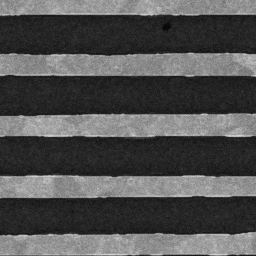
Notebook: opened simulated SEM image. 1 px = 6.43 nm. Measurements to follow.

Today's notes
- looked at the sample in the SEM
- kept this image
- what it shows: lines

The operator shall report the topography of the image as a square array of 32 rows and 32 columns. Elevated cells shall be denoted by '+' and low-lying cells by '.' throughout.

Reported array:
++++++++++++++++++++++++++++++++
++++++++++++++++++++++++++++++++
................................
................................
................................
................................
................................
++++++++++++++++++++++++++++++++
++++++++++++++++++++++++++++++++
................................
................................
................................
................................
................................
..+.++++++++++++++++++++++++++++
++++++++++++++++++++++++++++++++
++++++++++++++++++++++++++++++++
................................
................................
................................
................................
................................
++++++++++++++++++++++++++++++++
++++++++++++++++++++++++++++++++
++++++++++++++++++++++++..+++...
................................
................................
................................
................................
++++++++++++++++++++++++++++++++
++++++++++++++++++++++++++++++++
++++++++++++++++++++++++++++++++